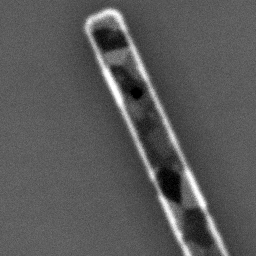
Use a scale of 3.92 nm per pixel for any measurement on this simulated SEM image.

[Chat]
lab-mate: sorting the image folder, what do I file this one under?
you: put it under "one or a few lines or trenches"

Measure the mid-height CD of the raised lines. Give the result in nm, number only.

132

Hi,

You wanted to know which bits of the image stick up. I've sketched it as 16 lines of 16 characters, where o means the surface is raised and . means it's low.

................
......oo........
......oo........
......oo........
.......oo.......
.......oo.......
........oo......
........oo......
........ooo.....
.........oo.....
.........ooo....
..........oo....
..........ooo...
...........oo...
...........oo...
............oo..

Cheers